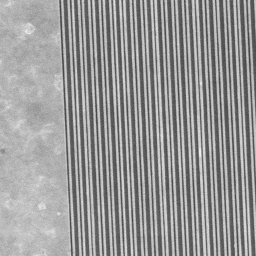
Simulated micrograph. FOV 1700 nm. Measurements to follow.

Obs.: parallel lines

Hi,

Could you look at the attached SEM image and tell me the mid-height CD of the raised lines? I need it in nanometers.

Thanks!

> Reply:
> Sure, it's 13.3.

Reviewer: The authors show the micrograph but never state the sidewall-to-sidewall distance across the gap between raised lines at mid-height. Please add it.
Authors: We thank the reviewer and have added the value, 0.0216 um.